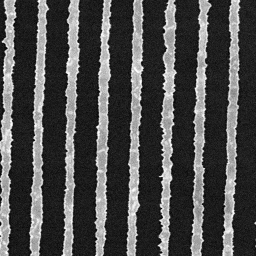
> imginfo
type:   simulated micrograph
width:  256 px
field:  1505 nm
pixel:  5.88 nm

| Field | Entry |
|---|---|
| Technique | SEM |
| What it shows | parallel lines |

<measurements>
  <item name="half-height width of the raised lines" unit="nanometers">49.2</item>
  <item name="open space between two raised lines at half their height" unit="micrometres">0.139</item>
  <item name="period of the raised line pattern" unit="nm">189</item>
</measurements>